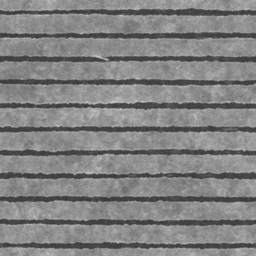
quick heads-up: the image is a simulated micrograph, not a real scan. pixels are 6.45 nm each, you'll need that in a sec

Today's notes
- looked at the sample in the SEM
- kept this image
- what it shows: parallel lines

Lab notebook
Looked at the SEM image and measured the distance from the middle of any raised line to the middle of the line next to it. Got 0.15 micrometres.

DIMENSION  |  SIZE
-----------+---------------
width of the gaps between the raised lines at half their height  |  37.1 nanometres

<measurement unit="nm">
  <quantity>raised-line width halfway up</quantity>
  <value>111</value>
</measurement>